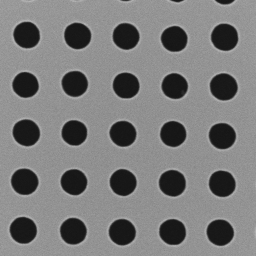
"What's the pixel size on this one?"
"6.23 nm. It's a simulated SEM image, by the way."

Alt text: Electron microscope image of a regular array of holes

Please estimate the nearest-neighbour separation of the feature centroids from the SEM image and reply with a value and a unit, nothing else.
300 nm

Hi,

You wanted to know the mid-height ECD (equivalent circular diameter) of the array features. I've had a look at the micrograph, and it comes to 163 nanometers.